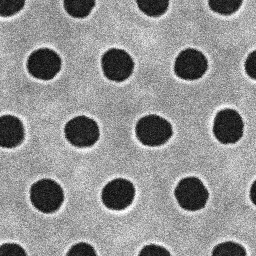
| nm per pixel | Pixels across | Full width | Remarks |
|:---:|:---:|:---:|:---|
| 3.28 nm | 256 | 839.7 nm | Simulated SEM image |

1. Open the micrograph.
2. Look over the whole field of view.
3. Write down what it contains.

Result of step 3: a regular array of holes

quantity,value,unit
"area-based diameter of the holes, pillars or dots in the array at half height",112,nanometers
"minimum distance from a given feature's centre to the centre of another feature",238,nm